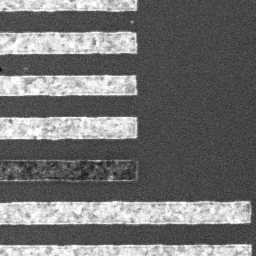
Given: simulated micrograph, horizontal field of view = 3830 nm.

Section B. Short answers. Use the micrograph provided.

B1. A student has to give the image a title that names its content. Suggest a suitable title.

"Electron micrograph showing wiring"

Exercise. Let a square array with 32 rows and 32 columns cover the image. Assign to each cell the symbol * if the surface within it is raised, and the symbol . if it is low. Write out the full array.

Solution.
*****************...............
................................
................................
................................
*****************...............
*****************...............
*****************...............
................................
................................
................................
*****************...............
*****************...............
................................
................................
................................
*****************...............
*****************...............
................................
................................
................................
*****************...............
*****************...............
*****...*********...............
................................
................................
*******************************.
*******************************.
*******************************.
................................
................................
................................
*******************************.